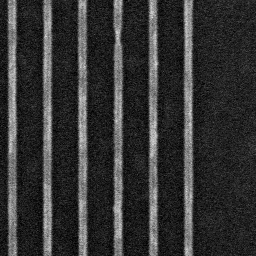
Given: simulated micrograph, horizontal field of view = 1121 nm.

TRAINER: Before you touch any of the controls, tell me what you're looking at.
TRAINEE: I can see parallel lines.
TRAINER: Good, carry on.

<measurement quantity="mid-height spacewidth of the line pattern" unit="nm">126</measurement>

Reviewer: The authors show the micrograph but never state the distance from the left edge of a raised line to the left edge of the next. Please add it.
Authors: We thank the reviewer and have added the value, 0.154 µm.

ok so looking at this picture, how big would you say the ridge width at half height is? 26.8 nanometres